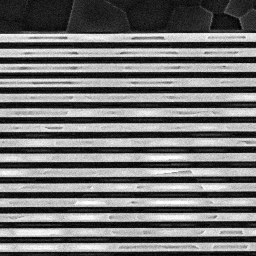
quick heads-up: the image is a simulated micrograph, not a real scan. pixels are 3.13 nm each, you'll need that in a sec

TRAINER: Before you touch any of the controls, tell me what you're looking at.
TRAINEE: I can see parallel lines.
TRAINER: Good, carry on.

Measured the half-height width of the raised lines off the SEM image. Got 0.027 micrometres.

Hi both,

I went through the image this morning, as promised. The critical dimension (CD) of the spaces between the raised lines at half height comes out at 0.0208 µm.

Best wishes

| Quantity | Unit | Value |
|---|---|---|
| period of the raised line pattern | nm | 46.8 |